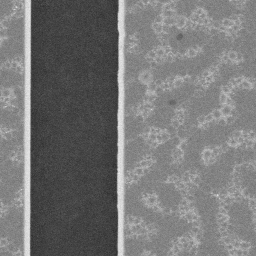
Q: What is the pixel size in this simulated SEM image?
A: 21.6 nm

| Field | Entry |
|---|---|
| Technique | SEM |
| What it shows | one or a few lines or trenches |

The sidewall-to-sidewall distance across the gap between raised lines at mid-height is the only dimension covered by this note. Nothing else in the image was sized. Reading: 2000 nanometers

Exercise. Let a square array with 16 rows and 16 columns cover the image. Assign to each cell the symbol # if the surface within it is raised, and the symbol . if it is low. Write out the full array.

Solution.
##......########
##......########
##......########
##......########
##......########
##......########
##......########
##......########
##......########
##......########
##......########
##......########
##......########
##......########
##......########
##......########